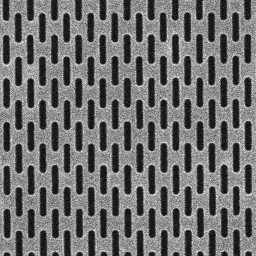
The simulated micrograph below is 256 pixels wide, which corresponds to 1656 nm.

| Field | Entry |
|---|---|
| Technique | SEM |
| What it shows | a regular array of holes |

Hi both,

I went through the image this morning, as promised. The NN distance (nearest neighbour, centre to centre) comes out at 155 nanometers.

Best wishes